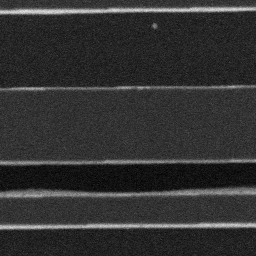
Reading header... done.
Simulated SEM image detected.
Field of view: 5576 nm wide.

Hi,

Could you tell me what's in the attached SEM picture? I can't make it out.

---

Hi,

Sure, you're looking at lines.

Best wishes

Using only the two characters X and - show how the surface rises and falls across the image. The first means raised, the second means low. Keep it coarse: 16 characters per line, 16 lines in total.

XXXXXXXXXXXXXXX-
----------------
----------------
----------------
----------------
-------XXXXXXXXX
XXXXXXXXXXXXXXXX
XXXXXXXXXXXXXXXX
XXXXXXXXXXXXXXXX
XXXXXXXXXXXXXXXX
----------------
----------------
XXXXXXXXXXXXXXXX
XXXXXXXXXXXXXXXX
----------------
----------------